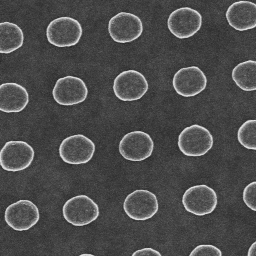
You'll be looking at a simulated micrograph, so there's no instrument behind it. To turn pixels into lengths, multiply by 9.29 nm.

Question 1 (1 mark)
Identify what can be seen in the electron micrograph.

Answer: a regular array of raised bodies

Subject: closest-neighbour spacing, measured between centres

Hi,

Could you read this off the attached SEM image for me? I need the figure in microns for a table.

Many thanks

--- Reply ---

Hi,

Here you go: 0.548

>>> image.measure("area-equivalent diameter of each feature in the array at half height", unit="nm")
290